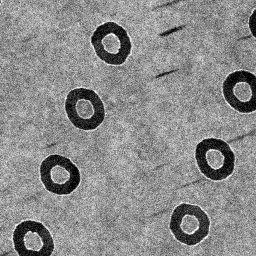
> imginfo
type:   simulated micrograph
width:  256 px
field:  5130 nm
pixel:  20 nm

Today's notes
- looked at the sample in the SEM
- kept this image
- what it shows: ring-shaped raised bodies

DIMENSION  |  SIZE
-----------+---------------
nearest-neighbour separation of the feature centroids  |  1420 nm